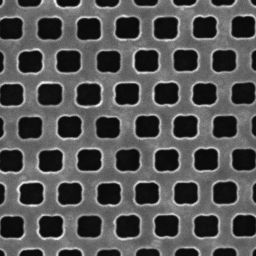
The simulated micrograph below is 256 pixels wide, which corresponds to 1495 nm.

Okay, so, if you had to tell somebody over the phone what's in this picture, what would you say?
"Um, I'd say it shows a regular array of holes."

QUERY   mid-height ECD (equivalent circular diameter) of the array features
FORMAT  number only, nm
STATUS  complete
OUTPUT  143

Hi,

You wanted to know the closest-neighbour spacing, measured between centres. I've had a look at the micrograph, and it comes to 221 nm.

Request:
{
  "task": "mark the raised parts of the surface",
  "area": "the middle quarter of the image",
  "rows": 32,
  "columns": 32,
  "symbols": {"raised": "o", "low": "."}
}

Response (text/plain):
....oooo......oooo......ooo.....
...oooooo.....oooo.....ooooo....
oooooooooooooooooooooooooooooooo
oooooooooooooooooooooooooooooooo
oooooooooooooooooooooooooooooooo
oooo.....oooo.....ooooo.....oooo
ooo......oooo......oooo......ooo
ooo......oooo......oooo......ooo
ooo......oooo......oooo......ooo
ooo......oooo.....ooooo.....oooo
oooooooooooooooooooooooooooooooo
oooooooooooooooooooooooooooooooo
oooooooooooooooooooooooooooooooo
....ooooo....ooooo.....ooooo....
....oooo......oooo......ooo.....
....oooo......oooo......oooo....
....oooo......oooo......ooo.....
....oooo......oooo......oooo....
...oooooo....oooooo.oooooooooooo
oooooooooooooooooooooooooooooooo
oooooooooooooooooooooooooooooooo
oooo....oooooo....oooooo....oooo
oooo.....oooo......oooo......ooo
ooo......oooo......oooo......ooo
ooo......oooo......oooo......ooo
ooo......oooo......oooo......ooo
oooo....oooooo....ooooo.....oooo
oooooooooooooooooooooooooooooooo
oooooooooooooooooooooooooooooooo
oooooooooooooooooooooooooooooooo
....ooooo.....oooo......oooo....
.....ooo......oooo......ooo.....